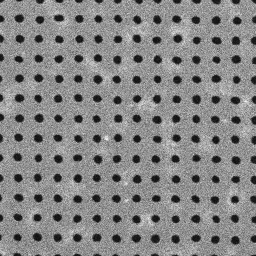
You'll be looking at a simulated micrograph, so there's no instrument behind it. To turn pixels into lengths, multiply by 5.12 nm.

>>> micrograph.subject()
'a regular array of holes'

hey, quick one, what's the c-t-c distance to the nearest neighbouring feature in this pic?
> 98.2 nm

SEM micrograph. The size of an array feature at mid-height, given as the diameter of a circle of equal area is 0.0425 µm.